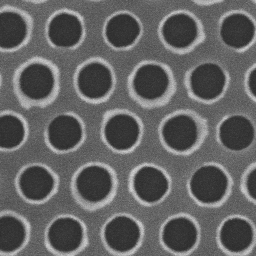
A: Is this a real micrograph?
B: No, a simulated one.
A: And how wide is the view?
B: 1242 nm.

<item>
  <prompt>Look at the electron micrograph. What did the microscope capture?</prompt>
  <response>a regular array of holes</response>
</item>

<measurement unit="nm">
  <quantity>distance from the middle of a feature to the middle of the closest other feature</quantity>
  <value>276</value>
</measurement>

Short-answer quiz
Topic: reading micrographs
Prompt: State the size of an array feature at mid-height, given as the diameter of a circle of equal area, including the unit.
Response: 168 nm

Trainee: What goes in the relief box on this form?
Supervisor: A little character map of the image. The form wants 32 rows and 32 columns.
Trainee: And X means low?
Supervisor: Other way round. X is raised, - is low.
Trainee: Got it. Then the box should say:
XXXXXXXXXXXXXXXXXXXXXXXXXXXXXXXX
XXXXXXXXXXXXXXXXXXXXXXXXXXXXXXXX
---XXX----XXXX---XXXX---XXXX---X
---XXX----XXX----XXX-----XXX----
---XXX----XXX----XXX-----XXX----
--XXXXX--XXXXX--XXXXX---XXXX---X
XXXXXXXXXXXXXXXXXXXXXXXXXXXXXXXX
XXXXXXXXXXXXXXXXXXXXXXXXXXXXXXXX
XXX---XXXX---XXXXX--XXXX---XXXXX
XXX----XXX----XXX----XXX----XXX-
XX-----XXX----XXX----XXX----XXX-
XXX---XXXX---XXXX----XXX----XXX-
XXXXXXXXXXXXXXXXXXXXXXXXXXXXXXXX
XXXXXXXXXXXXXXXXXXXXXXXXXXXXXXXX
--XXXXX-XXXXXX--XXXXXX--XXXXX--X
---XXX----XXX----XXXX---XXXX---X
---XXX----XXX----XXX-----XX-----
---XXX----XXX----XXXX----XX-----
X-XXXXX--XXXXX--XXXXX---XXXXX--X
XXXXXXXXXXXXXXXXXXXXXXXXXXXXXXXX
XXXXXXXXXXXXXXXXXXXXXXXXXXXXXXXX
XXX---XXXX----XXX---XXXXX---XXX-
XX-----XXX----XXX----XXX----XXX-
XXX----XXX----XXX----XXX----XXX-
XXX---XXXX---XXXX---XXXX----XXX-
XXXXXXXXXXXXXXXXXXXXXXXXXXXXXXXX
XXXXXXXXXXXXXXXXXXXXXXXXXXXXXXXX
--XXXXX--XXXXX--XXXXX---XXXX--XX
---XXX----XXX----XXX----XXXX---X
---XXX----XXX----XXX-----XXX----
---XXX----XXXX---XXXX---XXXX---X
XXXXXXXXXXXXXXXXXXXXXXXXXXXXX-XX